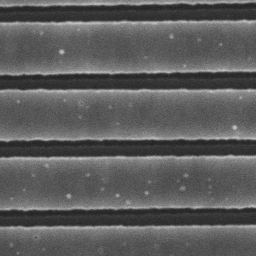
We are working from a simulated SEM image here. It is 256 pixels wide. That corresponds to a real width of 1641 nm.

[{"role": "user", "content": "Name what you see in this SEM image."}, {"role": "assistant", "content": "lines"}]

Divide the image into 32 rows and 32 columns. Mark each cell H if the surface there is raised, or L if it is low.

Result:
HHHHHHHHHHHHHHHLHHLLLLLLLLLLLLLL
LLLLLLLLLLLLLLLLLLLLLLLLLLLLLLLL
LLLLLLLLLLLLLLLLLLLLLLLLLLLLLLLL
HHHHHHHHHHHHHHHHHHHHHHHHHHHHHHHH
HHHHHHHHHHHHHHHHHHHHHHHHHHHHHHHH
HHHHHHHHHHHHHHHHHHHHHHHHHHHHHHHH
HHHHHHHHHHHHHHHHHHHHHHHHHHHHHHHH
HHHHHHHHHHHHHHHHHHHHHHHHHHHHHHHH
HHHHHHHHHHHHHHHHHHHHHHHHHHHHHHHH
LLLLLLLLLLLLLLLLLLLLLLLLLLLLLLLL
LLLLLLLLLLLLLLLLLLLLLLLLLLLLLLLL
HHHHHHHHHHHHHHHHHHHHHHHHHHHHHHHH
HHHHHHHHHHHHHHHHHHHHHHHHHHHHHHHH
HHHHHHHHHHHHHHHHHHHHHHHHHHHHHHHH
HHHHHHHHHHHHHHHHHHHHHHHHHHHHHHHH
HHHHHHHHHHHHHHHHHHHHHHHHHHHHHHHH
HHHHHHHHHHHHHHHHHHHHHHHHHHHHHHHH
HHHHLHLHHHLLHLLLLLLLLLLLLLLLLLLL
LLLLLLLLLLLLLLLLLLLLLLLLLLLLLLLL
LLLLLLLLLLLLLLLLLLLLLLLLLLLLLLLL
HHHHHHHHHHHHHHHHHHHHHHHHHHHHHHHH
HHHHHHHHHHHHHHHHHHHHHHHHHHHHHHHH
HHHHHHHHHHHHHHHHHHHHHHHHHHHHHHHH
HHHHHHHHHHHHHHHHHHHHHHHHHHHHHHHH
HHHHHHHHHHHHHHHHHHHHHHHHHHHHHHHH
HHHHHHHHHHHHHHHHHHHHHHHHHHHHHHHH
LLLLLLLLLLLLLLLLLLLLLLLLLLLLLLLL
LLLLLLLLLLLLLLLLLLLLLLLLLLLLLLLL
HHHHHHHHHHHHHHHHHHHHHHHHHHHHHHHH
HHHHHHHHHHHHHHHHHHHHHHHHHHHHHHHH
HHHHHHHHHHHHHHHHHHHHHHHHHHHHHHHH
HHHHHHHHHHHHHHHHHHHHHHHHHHHHHHHH